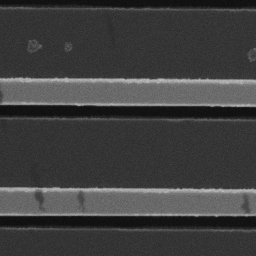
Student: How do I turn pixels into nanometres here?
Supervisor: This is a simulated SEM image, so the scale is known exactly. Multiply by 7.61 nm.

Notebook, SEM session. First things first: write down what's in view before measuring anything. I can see lines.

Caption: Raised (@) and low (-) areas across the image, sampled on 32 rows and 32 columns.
--------------------------------
@@@@@@@@@@@@@@@@@@@@@@@@@@@@@@@@
@@@@@@@@@@@@@@@@@@@@@@@@@@@@@@@@
@@@@@@@@@@@@@@@@@@@@@@@@@@@@@@@@
@@@@@@@@@@@@@@@@@@@@@@@@@@@@@@@@
@@@@@@@@@@@@@@@@@@@@@@@@@@@@@@@@
@@@@@@@@@@@@@@@@@@@@@@@@@@@@@@@@
@@@@@@@@@@@@@@@@@@@@@@@@@@@@@@@@
@@@@@@@@@@@@@@@@@@@@@@@@@@@@@@@@
@@@@@@@@@@@@@@@@@@@@@@@@@@@@@@@@
@@@@@@@@@@@@@@@@@@@@@@@@@@@@@@@@
@@@@@@@@@@@@@@@@@@@@@@@@@@@@@@@@
@@@@@@@@@@@@@@@@@@@@@@@@@@@@@@@@
--------------------------------
--------------------------------
@@@@@@@@@@@@@@@@@@@@@@@@@@@@@@@@
@@@@@@@@@@@@@@@@@@@@@@@@@@@@@@@@
@@@@@@@@@@@@@@@@@@@@@@@@@@@@@@@@
@@@@@@@@@@@@@@@@@@@@@@@@@@@@@@@@
@@@@@@@@@@@@@@@@@@@@@@@@@@@@@@@@
@@@@@@@@@@@@@@@@@@@@@@@@@@@@@@@@
@@@@@@@@@@@@@@@@@@@@@@@@@@@@@@@@
@@@@@@@@@@@@@@@@@@@@@@@@@@@@@@@@
@@@@@@@@@@@@@@@@@@@@@@@@@@@@@@@@
@@@@@@@@@@@@@@@@@@@@@@@@@@@@@@@@
@@@@@@@@@@@@@@@@@@@@@@@@@@@@@@@@
@@@@@@@@@@@@@@@@@@@@@@@@@@@@@@@@
--------------------------------
--------------------------------
@@@@@@@@@@@@@@@@@@@@@@@@@@@@@@@@
@@@@@@@@@@@@@@@@@@@@@@@@@@@@@@@@
@@@@@@@@@@@@@@@@@@@@@@@@@@@@@@@@